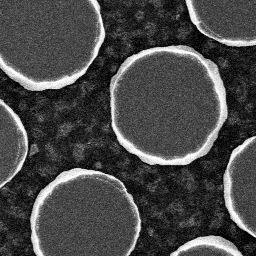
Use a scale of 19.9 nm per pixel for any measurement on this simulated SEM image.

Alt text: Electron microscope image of raised bodies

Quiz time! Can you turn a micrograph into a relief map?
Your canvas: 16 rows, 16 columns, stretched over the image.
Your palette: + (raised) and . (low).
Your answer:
++++++......++++
++++++......++++
++++++........++
++++++...+++....
+++++...+++++...
.......+++++++..
.......+++++++..
+......+++++++..
++.....++++++...
++......+++++..+
+.............++
...+++++......++
..++++++......++
..+++++++.....++
..+++++++......+
..++++++...+++..